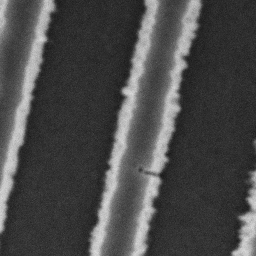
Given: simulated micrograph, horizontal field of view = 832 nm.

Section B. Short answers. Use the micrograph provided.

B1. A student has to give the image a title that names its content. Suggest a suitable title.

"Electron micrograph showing one or a few lines or trenches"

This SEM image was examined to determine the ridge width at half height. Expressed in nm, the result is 141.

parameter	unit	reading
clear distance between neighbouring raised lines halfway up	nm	326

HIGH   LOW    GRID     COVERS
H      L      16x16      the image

HHHLLLLLLHHHLLLL
HHHLLLLLLHHHLLLL
HHHLLLLLLHHHLLLL
HHLLLLLLLHHLLLLL
HHLLLLLLHHHLLLLL
HHLLLLLLHHHLLLLL
HHLLLLLLHHHLLLLL
HLLLLLLLHHHLLLLL
HLLLLLLLHHLLLLLL
HLLLLLLHHHLLLLLL
HLLLLLLHHHLLLLLL
LLLLLLLHHHLLLLLL
LLLLLLLHHLLLLLLL
LLLLLLHHHLLLLLLL
LLLLLLHHHLLLLLLH
LLLLLLHHHLLLLLLH